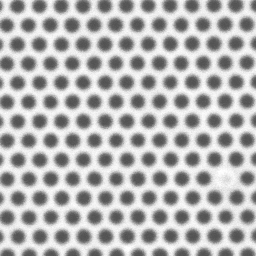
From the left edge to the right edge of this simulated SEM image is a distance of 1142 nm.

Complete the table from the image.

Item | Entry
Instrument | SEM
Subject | a regular array of holes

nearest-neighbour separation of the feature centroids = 0.0968 micrometres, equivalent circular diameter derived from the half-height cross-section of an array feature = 72 nm